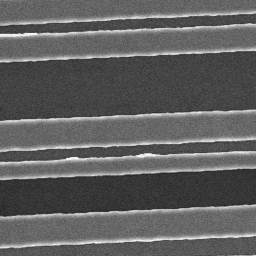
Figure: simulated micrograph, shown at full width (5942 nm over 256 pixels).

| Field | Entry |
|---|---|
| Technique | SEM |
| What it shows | lines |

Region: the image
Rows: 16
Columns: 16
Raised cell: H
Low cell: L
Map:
HHHHHHHHHHHHHHHH
HHHHHHHHHHHHHHHH
HHHHHHHHHHHHHHHH
HHHHHHHHLLLLLLLL
LLLLLLLLLLLLLLLL
LLLLLLLLLLLLLLLL
LLLLLLLLLLLLLLLL
LLHHHHHHHHHHHHHH
HHHHHHHHHHHHHHHH
HHHHHHHHHHHHHHHH
HHHHHHHHHHHHHHHH
LLLLLLLLLLLLLLLL
LLLLLLLLLLLLLLLL
LLHHHHHHHHHHHHHH
HHHHHHHHHHHHHHHH
HHHHHHHHHHHHHHHH